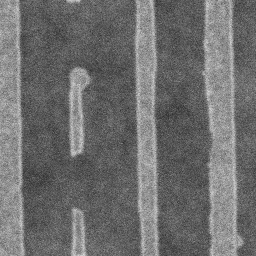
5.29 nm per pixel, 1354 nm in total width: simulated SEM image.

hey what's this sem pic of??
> one or a few lines or trenches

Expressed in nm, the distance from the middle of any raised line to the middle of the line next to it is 387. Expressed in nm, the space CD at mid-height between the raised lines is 294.